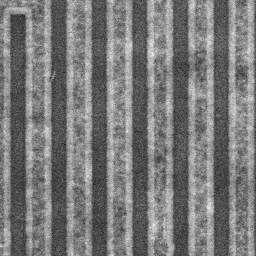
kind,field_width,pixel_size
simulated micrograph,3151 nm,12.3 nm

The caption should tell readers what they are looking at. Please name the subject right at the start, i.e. parallel lines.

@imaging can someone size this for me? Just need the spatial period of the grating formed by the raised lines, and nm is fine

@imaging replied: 500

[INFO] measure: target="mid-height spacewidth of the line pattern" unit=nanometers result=254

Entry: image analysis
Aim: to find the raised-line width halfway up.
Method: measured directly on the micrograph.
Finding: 254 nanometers